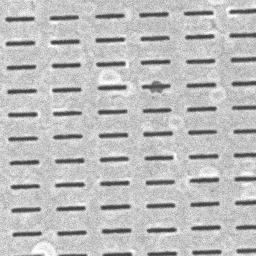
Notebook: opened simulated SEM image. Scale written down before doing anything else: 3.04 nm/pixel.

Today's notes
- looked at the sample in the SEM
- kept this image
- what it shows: a regular array of holes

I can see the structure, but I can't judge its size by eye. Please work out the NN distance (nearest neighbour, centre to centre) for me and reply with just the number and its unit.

0.0722 µm